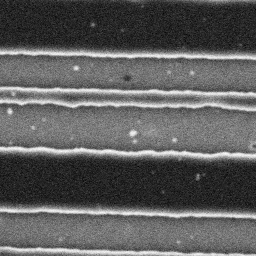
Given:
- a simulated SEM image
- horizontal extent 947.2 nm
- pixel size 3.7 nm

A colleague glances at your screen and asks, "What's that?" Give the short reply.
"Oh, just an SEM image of lines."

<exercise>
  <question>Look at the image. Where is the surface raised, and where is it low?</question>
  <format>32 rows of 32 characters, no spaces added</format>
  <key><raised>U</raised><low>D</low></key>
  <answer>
UUUUUUUUUUUUUUUUUUUUUUUUUUUUUUUU
UUUUUUUUUUUUUUUUUUUUUUUUUUUUUUUU
UUUUUUUUUUUUUUUUUUUUUUUUUUUUUUUU
UUUUUUUUUUUUUUUUUUUUUUUUUUUUUUUU
UUUUUUUUUUUUUUUUUUUUUUUUUUUUUUUU
UUUUUUUUUUUUUUUUUUUUUUUUUUUUUUUU
UUUUUUUUUUUUUUUUUUUUUUUUUUUUUUUU
DDDDDDDDDDDDDDDDDDDDDDDDDDDDDDDD
DDDDDDDDDDDDDDDDDDDDDDDDDDDDDDDD
DDDDDDDDDDDDDDDDDDDDDDDDDDDDDDDD
DDDDDDDDDDDDDDDDDDDDDDDDDDDDDDDD
UUUUUUUUUUUUUUUUUUUUUUUUDDDDDDDD
UUUUUUUUUUUUUUUUUUUUUUUUUUUUUUUU
DDDDDDDDDDDDDDDDDDDDDDDDDDDDUUUU
DDDDDDDDDDDDDDDDDDDDDDDDDDDDDDDD
DDDDDDDDDDDDDDDDDDDDDDDDDDDDDDDD
DDDDDDDDDDDDDDDDDDDDDDDDDDDDDDDD
DDDDDDDDDDDDDDDDDDDDDDDDDDDDDDDD
UUUDDUDDDDDDDDDDDDDDDDDDDDDDDDDD
UUUUUUUUUUUUUUUUUUUUUUUUUUUUUUUU
UUUUUUUUUUUUUUUUUUUUUUUUUUUUUUUU
UUUUUUUUUUUUUUUUUUUUUUUUUUUUUUUU
UUUUUUUUUUUUUUUUUUUUUUUUUUUUUUUU
UUUUUUUUUUUUUUUUUUUUUUUUUUUUUUUU
UUUUUUUUUUUUUUUUUUUUUUUUUUUUUUUU
UUUUUUUUUUUUUUUUUUUUUUUUUUUUUUUU
DDDDDDDDUUUUUUUUUUUUUUUUUUUUUUUU
DDDDDDDDDDDDDDDDDDDDDDDDDDDDDDDD
DDDDDDDDDDDDDDDDDDDDDDDDDDDDDDDD
DDDDDDDDDDDDDDDDDDDDDDDDDDDDDDDD
DDDDDDDDDDDDDDDDDDDDDDDDDDDDDDDD
UUUUUUUUUUUUUUUUUDUUDDDDDDDDDDDD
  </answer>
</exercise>